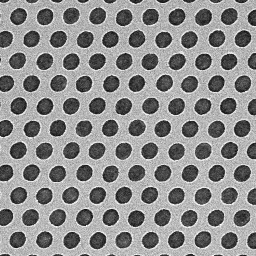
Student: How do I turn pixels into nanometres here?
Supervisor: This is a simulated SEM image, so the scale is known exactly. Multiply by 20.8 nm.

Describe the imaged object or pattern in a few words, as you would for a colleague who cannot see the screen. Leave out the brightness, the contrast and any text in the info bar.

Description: a regular array of holes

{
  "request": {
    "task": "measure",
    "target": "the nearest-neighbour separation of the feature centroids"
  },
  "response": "529 nanometers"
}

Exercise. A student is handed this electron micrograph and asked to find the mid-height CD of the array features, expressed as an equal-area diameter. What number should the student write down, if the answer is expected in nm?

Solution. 359